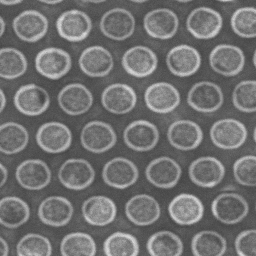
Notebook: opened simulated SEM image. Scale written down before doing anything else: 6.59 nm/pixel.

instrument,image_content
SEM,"a regular array of raised bodies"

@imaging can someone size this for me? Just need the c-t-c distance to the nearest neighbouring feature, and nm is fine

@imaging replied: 281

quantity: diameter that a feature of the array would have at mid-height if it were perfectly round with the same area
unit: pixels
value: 30.2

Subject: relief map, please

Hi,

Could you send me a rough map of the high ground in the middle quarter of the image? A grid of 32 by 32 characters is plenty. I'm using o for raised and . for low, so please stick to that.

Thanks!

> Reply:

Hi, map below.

o...oooooooo...oooooooo...oooooo
o....oooooo.....oooooo.....ooooo
......oooo........ooo........oo.
................................
................................
.ooo........ooo.......oooo......
ooooo......oooooo....ooooooo....
oooooo....ooooooo....ooooooo...o
ooooooo...ooooooo...oooooooo...o
ooooooo...ooooooo....ooooooo...o
oooooo....ooooooo....ooooooo....
oooooo.....ooooo.......ooo......
................................
................................
.............................oo.
......ooooo.....oooooo.....ooooo
o....ooooooo....ooooooo....ooooo
o....ooooooo...oooooooo....ooooo
o....ooooooo...oooooooo....ooooo
o....ooooooo....ooooooo....ooooo
o....oooooo......ooooo......oooo
.......oo.......................
................................
................................
.oooo.......oooo.......oooo.....
oooooo.....oooooo....ooooooo....
ooooooo...oooooooo...oooooooo...
ooooooo...oooooooo...oooooooo...
ooooooo...oooooooo...ooooooo....
ooooooo....oooooo.....oooooo....
.oooo........ooo........ooo.....
................................